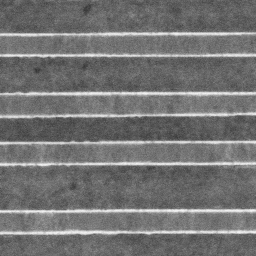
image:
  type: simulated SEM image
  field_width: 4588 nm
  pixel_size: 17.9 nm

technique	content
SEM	lines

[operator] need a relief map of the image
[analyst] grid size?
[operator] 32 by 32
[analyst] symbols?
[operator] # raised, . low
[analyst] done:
................................
................................
................................
................................
################################
################################
################################
................................
................................
................................
................................
................................
################################
################################
#############..#................
................................
................................
................................
################################
################################
###########################.##..
................................
................................
................................
................................
................................
################################
################################
################################
................................
................................
................................